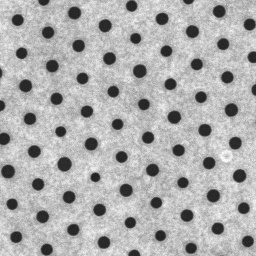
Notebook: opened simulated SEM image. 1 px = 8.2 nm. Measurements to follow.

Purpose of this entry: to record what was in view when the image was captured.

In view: a regular array of holes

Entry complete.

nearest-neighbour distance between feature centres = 269 nm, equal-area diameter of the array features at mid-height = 100 nm